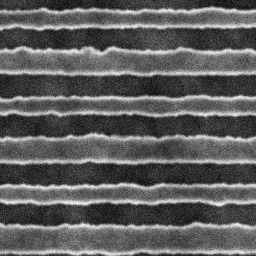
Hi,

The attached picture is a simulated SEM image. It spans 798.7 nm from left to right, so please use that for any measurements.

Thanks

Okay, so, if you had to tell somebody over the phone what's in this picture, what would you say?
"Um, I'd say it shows lines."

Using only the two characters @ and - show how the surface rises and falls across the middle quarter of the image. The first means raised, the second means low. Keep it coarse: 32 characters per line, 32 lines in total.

@@@@@@@@@@@@@@@@@@@@@@@@@@@@@@@@
@@@@@@@@@@@@@@@@@@@@@@@@@@@@@@@@
@@@--@@@@@---@---@@@@@@--@@-----
--------------------------------
--------------------------------
--------------------------------
--------------------------------
--------------------------------
@@@@-@@--@@@@@-----@@@@@@@----@@
@@@@@@@@@@@@@@@@@@@@@@@@@@@@@@@@
@@@@@@@@@@@@@@@@@@@@@@@@@@@@@@@@
@@@@@@@@@@@@@@@@@@@@@@@@@@@@@@@@
@@@@@@--@@@@@@-@@-@@@@@@@@@@@@-@
--------------------------------
--------------------------------
--------------------------------
--------------------------------
------@@------------------------
@@@@@@@@@@@@@@--@@@-@@---@@@@@@@
@@@@@@@@@@@@@@@@@@@@@@@@@@@@@@@@
@@@@@@@@@@@@@@@@@@@@@@@@@@@@@@@@
@@@@@@@@@@@@@@@@@@@@@@@@@@@@@@@@
@@@@@@@@@@@@@@@@@@@@@@@@@@@@@@@@
@@@@@@@@@@@@@@@@@@@@@@@@@@@@@@@@
@-@@@---@@@-@@@@@@@@@--@@@@@@@@@
--------------------------------
--------------------------------
--------------------------------
--------------------------------
--------------------------------
@--@@@@@-@@@@@@@@@@---@@@@@@@@@@
@@@@@@@@@@@@@@@@@@@@@@@@@@@@@@@@